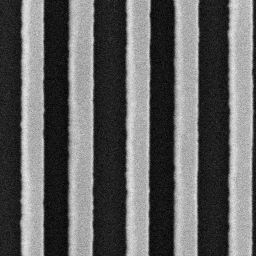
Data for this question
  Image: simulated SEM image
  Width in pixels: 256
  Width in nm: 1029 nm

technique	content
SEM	lines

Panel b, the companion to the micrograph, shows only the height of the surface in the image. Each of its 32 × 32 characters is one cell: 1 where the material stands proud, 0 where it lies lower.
00011000011100001110001110000111
00011000011100001110001110000111
00011000011100001110001110000111
00011000011100001110001110000111
00011000011100001110001110000111
00011000011100001110001110000111
00011000011100001110001110000111
00011000011100001110001110000111
00011000011100001110001110000111
00011000011100001110001110000111
00011000011100001110001110000111
00011000011100001110001110000111
00011000011100001110001110000111
00011000011100001110001110000111
00011000011100001110001110000111
00011000011100001110001110000111
00011000011100001110001110000111
00011000011100001110001110000111
00011000011100001110001110000111
00011000011100001110001110000110
00011000011100001110001110000110
00011000011100001110001110000110
00011000011100001110001110000110
00011000011100001110001110000110
00011000011100001110001110000110
00011000011100001110001110000110
00011000011100001110001110000110
00011000011100001110001110000110
00011000011100001110001110000110
00011000011100001110001110000110
00011000011000001110001110000110
00011000011000001110001110000110